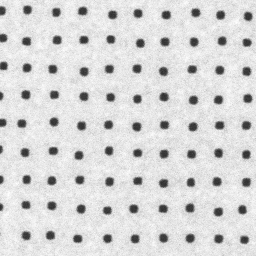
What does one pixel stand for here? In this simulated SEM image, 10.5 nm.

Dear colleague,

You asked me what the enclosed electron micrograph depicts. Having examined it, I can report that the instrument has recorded a regular array of holes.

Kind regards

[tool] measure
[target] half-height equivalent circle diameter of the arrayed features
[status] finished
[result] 108 nm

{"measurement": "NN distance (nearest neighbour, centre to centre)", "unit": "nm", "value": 274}